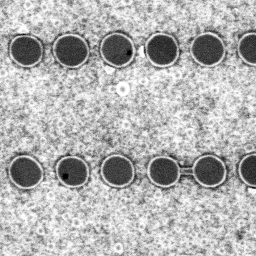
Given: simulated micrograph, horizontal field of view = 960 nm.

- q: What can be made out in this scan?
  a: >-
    a regular array of raised bodies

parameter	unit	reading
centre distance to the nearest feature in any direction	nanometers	169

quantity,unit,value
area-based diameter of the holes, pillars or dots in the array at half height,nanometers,123